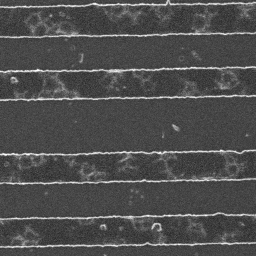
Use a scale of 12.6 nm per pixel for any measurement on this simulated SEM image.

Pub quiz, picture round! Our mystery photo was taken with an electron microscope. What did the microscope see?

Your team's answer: one or a few lines or trenches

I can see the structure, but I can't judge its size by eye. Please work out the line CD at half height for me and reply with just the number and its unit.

364 nanometres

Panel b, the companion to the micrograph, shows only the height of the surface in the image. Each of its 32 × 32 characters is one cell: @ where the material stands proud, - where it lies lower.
---------------------@--@-@-@@@@
@@@@@@@@@@@@@@@@@@@@@@@@@@@@@@@@
@@@@@@@@@@@@@@@@@@@@@@@@@@@@@@@@
@@@@@@@@@@@@@@@@@@@@@@@@@@@@@@@@
@@@@@@@@---@@-------------------
--------------------------------
--------------------------------
--------------------------------
------------------------@---@@@@
@@@@@@@@@@@@@@-@@@@@@@@@@@@@@@@@
@@@@@@@-@@@@@@@@@@@@@@@@@@@@@@@@
@@@@@@@-@@@@@@@@@@@@@@@@@@@@@@@@
---@----------------------------
--------------------------------
--------------------------------
--------------------------------
--------------------------------
--------------------------------
--------------------------------
@@@@@@@@@@@@@@@@@@@@@@@@@@@@@@@@
@@@@@@@@@@@@@@@@@@@@@@@@@@@@@@@@
@@@@@@@@@@@@@@@@@@@@@@@@@@@@@@@@
@@@@@@@@@@@@@@@@@@@@@@@@@@@@----
--------------------------------
--------------------------------
--------------------------------
--------------------------------
@@@@@@@@@@@@@@@@@@@@@@@@@@@@@@@@
@@@@@@@@@@@@@@@@@@@@@@@@@@@@@@@@
@@@@@@@@@@@@@@@@@@@@@@@@@@@@@@@@
@@@@@@@@@@@@@@@@@@-@@@@@@-------
--------------------------------